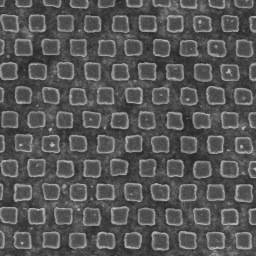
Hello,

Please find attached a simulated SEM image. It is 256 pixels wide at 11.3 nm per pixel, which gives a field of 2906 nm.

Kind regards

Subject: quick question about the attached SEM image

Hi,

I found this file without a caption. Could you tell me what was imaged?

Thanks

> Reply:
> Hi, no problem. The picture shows a regular array of raised bodies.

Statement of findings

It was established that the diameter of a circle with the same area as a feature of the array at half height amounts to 209 nm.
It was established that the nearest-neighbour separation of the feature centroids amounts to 305 nanometres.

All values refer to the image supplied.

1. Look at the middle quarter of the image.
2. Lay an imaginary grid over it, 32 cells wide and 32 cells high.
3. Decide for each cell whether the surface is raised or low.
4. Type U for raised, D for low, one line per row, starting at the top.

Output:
UUDDDUUUUDDDUUUUDDDUUUUDDDUUUUDD
UUDDDUUUUDDDUUUUDDDUUUUDDDUUUUDD
UUDDDUUUUDDDUUUUDDDUUUUDDDUUUUDD
UUDDDDUUUDDDUUUUDDDUUUUDDDUUUUDD
DDDDDDDDDDDDDDDDDDDDDDDDDDDDDDDD
DDDDDDDDDDDDDDDDDDDDDDDDDDDDDDDD
DDUUUDDDUUUUDDDDUUUDDDUUUUDDDUUU
DUUUUDDDUUUUDDDDUUUDDDUUUUDDDUUU
DUUUUDDDUUUUDDDDUUUUDDUUUUDDDUUU
DDUUUDDDUUUUDDDDUUUDDDUUUUDDDUUU
DDDDDDDDDDDDDDDDDDDDDDDDDDDDDDDD
DDDDDDDDDDDDDDDDDDDDDDDDDDDDDDDD
UUDDDUUUUDDDUUUUDDDUUUDDDDUUUDDD
UUDDDUUUUDDDUUUUDDDUUUUDDDUUUDDD
UUDDDUUUUDDDUUUUDDDUUUUDDDUUUUDD
UUDDDUUUUDDDUUUUDDDUUUUDDDUUUUDD
DDDDDDDDDDDDDDDDDDDDDDDDDDDDDDDD
DDDDDDDDDDDDDDDDDDDDDDDDDDDDDDDD
DUUUUDDDUUUUDDDUUUUUDDUUUUDDDUUU
DUUUUUDDDUUUDDDDUUUUDDUUUUDDDUUU
DDUUUUDDUUUUUDDDUUUDDDUUUUDDDUUU
DDUUUDDDUUUUDDDDUUUDDDUUUUDDDUUU
DDDDDDDDDDDDDDDDDDDDDDDDDDDDDDDD
DDDDDDDDDDDDDDDDDDDDDDDDDDDDDDDD
UUDDDUUUUDDDUUUUDDDUUUUDDDUUUDDD
UUDDDUUUUDDDUUUUDDDUUUUDDDUUUUDD
UUDDDUUUUDDDUUUUDDDUUUUDDDUUUUDD
UUDDDUUUUDDDUUUDDDDUUUUDDDUUUUDD
DDDDDDDDDDDDDDDDDDDDDDDDDDDDDDDD
DDDDDDDDDDDDDDDDDDDDDDDDDDDDDDDD
DDUUUDDDUUUUDDDUUUUDDDUUUUDDDUUU
DDUUUUDDUUUUDDDUUUUDDDUUUUDDDUUU